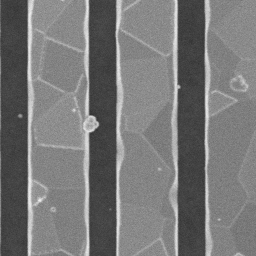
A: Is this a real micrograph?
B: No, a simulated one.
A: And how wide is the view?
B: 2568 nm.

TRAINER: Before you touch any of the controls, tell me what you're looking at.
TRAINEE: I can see wiring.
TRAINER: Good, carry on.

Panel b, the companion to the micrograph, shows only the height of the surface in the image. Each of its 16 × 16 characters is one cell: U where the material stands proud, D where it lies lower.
DDUUUDDUUUUDDUUU
DDUUUDDUUUUDDUUU
DDUUUDDUUUUDDUUU
DDUUUDDUUUUDDUUU
DDUUUDDUUUUDDUUU
DDUUUDDUUUUDDUUU
DDUUUDDUUUUDDUUU
DDUUUUDUUUUDDUUU
DDUUUUDUUUUDDUUU
DDUUUDDDUUUDDUUU
DDUUUDDUUUUDDUUU
DDUUUDDUUUUDDUUU
DDUUUDDUUUUDDUUU
DDUUUDDUUUUDDUUU
DDUUUDDUUUUDDUUU
DDUUUDDUUUUDDUUU